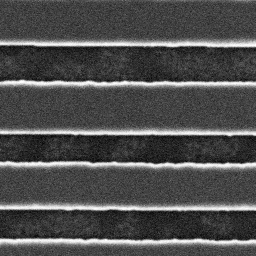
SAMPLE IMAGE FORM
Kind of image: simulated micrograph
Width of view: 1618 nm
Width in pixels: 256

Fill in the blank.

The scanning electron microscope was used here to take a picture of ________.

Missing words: lines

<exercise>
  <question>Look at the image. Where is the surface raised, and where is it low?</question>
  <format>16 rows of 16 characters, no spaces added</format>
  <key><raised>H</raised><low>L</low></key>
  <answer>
HHHHHHHHHHHHHHHH
HHHHHHHHHHHHHHHH
HHHHHHHHHHHHHHHH
LLLLLLLLLLLLLLLL
LLLLLLLLLLLLLLLL
HHHHHHHHHHHHHHHH
HHHHHHHHHHHHHHHH
HHHHHHHHHHHHHHHH
LLLLLLLLLLLLLLLL
LLLLLLLLLLLLLLLL
HHHHHHHHHHHHHHHH
HHHHHHHHHHHHHHHH
HHHHHHHHHHHHHHHH
LLLLLLLLLLLLLLLL
LLLLLLLLLLLLLLLL
HHHHHHHHHHHHHHHH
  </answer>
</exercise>